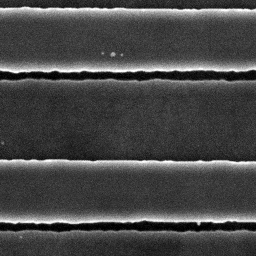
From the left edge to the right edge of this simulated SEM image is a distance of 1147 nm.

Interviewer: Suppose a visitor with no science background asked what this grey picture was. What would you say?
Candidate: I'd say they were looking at lines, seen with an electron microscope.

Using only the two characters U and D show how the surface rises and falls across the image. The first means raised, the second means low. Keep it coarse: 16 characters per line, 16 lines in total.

DUDDDDDDDDDDDDDD
UUUUUUUUUUUUUUUU
UUUUUUUUUUUUUUUU
UUUUUUUUUUUUUUUU
DDDDDDDDDDDDDDDD
DDDDDDDDDDDDDDDD
DDDDDDDDDDDDDDDD
DDDDDDDDDDDDDDDD
DDDDDDDDDDDDDDDD
DDDDDDDDDDDDDDDD
UUUUUUUUUUUUUUUU
UUUUUUUUUUUUUUUU
UUUUUUUUUUUUUUUU
UUUUUUUUUUUUUUUU
DDDDDDDDDDDDDDDD
DDDDDDDDDDDDDDDD